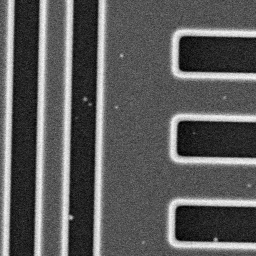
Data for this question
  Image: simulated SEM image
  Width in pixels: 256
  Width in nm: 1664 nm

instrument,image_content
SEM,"groups of lines, slits or small figures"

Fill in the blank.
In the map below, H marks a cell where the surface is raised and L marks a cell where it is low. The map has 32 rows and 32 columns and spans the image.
HLLLLHHHHLLLLHHHHHHHHHHHHHHHHHHH
HLLLLHHHHLLLLHHHHHHHHHHHHHHHHHHH
HLLLLHHHHLLLLHHHHHHHHHHHHHHHHHHH
HLLLLHHHHLLLLHHHHHHHHHHHHHHHHHHH
HLLLLHHHHLLLLHHHHHHHHHLLLLLLLLLL
HLLLLHHHHLLLLHHHHHHHHHLLLLLLLLLL
HLLLLHHHHLLLLHHHHHHHHHLLLLLLLLLL
HLLLLHHHHLLLLHHHHHHHHHLLLLLLLLLL
HLLLLHHHHLLLLHHHHHHHHHLLLLLLLLLL
HLLLLHHHHLLLLHHHHHHHHHHHHHHHHLLL
HLLLLHHHHLLLLHHHHHHHHHHHHHHHHHHH
HLLLLHHHHLLLHHHHHHHHHHHHHHHHHHHH
HLLLLHHHHLLLHHHHHHHHHHHHHHHHHHHH
HLLLLHHHHLLLHHHHHHHHHHHHHHHHHHHH
HLLLLHHHHLLLHHHHHHHHHHHHHHHHHHHH
HLLLLHHHLLLLHHHHHHHHHHLLLLLLLLLL
HLLLLHHHLLLLHHHHHHHHHHLLLLLLLLLL
HLLLLHHHLLLLHHHHHHHHHHLLLLLLLLLL
HLLLLHHHLLLLHHHHHHHHHHLLLLLLLLLL
HLLLLHHHLLLLHHHHHHHHHHLLLLLLLLLL
HLLLLHHHLLLLHHHHHHHHHHHHHHHHHHHH
HLLLLHHHLLLLHHHHHHHHHHHHHHHHHHHH
HLLLLHHHLLLLHHHHHHHHHHHHHHHHHHHH
HLLLLHHHLLLLHHHHHHHHHHHHHHHHHHHH
HLLLLHHHLLLLHHHHHHHHHHHHHHHHHHHH
HLLLLHHHLLLLHHHHHHHHHHLLLLLLLLLL
HLLLLHHHLLLLHHHHHHHHHHLLLLLLLLLL
HLLLLHHHLLLLHHHHHHHHHLLLLLLLLLLL
HLLLLHHHLLLLHHHHHHHHHLLLLLLLLLLL
HLLLLHHHLLLLHHHHHHHHHHLLLLLLLLLL
HLLLLHHHLLLLHHHHHHHHHHHLLLLLLLLL
HLLLLHHHLLLLHHHHHHHHHHHHHHHHHHHH